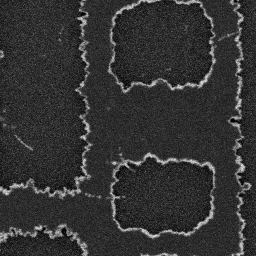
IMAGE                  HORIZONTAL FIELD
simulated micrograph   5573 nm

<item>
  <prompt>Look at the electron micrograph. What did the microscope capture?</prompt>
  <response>one or a few lines or trenches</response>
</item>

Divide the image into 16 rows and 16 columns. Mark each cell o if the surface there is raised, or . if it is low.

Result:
.....ooo.....oo.
.....oo......oo.
.....oo......oo.
.....oo......oo.
.....oo......oo.
.....oooooooooo.
.....oooooooooo.
.....oooooooooo.
.....oooooooooo.
.....oooooooooo.
.....oo......oo.
.o...oo......oo.
ooooooo......oo.
ooooooo......oo.
oo.oooooo.o.ooo.
.....oooooooooo.